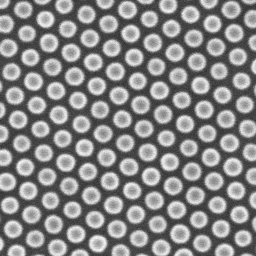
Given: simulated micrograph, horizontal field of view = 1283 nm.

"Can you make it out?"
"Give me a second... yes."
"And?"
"a regular array of raised bodies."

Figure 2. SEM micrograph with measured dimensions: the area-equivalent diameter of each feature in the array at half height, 80.2 nm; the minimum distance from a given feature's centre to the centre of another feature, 118 nm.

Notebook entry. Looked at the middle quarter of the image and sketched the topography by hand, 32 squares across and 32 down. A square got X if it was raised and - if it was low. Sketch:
-----XXXX--XXX-------XXXX-------
-XXX-------XXXX------XXXX---XX--
-XXXX------XXXX---X---XX---XXX--
-XXXX-------XX---XXX-------XXX--
-XXX---XXX-------XXX-------XXX--
------XXXX-------XXX--XXXX------
-------XXX--XXX-------XXXX------
---X--------XXXX------XXXX--XXX-
--XXX-------XXXX--XX---XX--XXXX-
--XXX--------XX--XXXX-------XXX-
--XXX--XXXX------XXXX-------XXX-
-------XXXX-------XXX--XXX------
X------XXXX--XXX-------XXXX-----
X--XX--------XXX-------XXXX--XX-
---XXX-------XXXX--XX---X---XXXX
---XXX--------XX--XXXX------XXXX
---XXX--XXXX------XXXX-------XXX
X-------XXXX-------XX---XXX-----
XX------XXX---XXX-------XXX-----
X---XX-------XXXX-------XXX---XX
---XXXX------XXXX---XX-------XXX
---XXXX-------XX---XXXX------XXX
----XX---XXX-------XXXX-------XX
XX-------XXXX-------XX---XXX----
XX-------XXX---XXX------XXXX----
XX---XX-------XXXX-------XXX---X
X---XXXX------XXXX---XX-------XX
----XXXX---X----X---XXXX------XX
-----XX---XXX-------XXXX-------X
XXX------XXXX-------XXX--XXXX---
XXX-------XXX--XXX-------XXXX---
XXX--XXX-------XXXX------XXXX--X